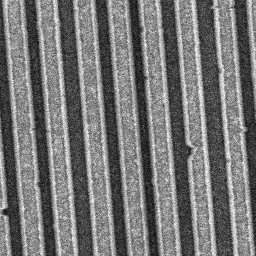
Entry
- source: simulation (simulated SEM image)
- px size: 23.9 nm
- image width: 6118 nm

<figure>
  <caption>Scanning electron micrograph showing parallel lines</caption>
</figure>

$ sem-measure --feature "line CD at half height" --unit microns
0.414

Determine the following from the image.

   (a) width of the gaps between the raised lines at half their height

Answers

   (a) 393 nanometres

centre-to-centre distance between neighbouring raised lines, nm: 835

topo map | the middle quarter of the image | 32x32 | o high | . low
....ooooo....oooo....oooo....ooo
....ooooo....oooo....oooo.....oo
.....oooo....oooo....oooo.....oo
.....oooo....oooo....oooo.....oo
.....oooo....oooo....oooo.....oo
.....oooo....oooo....oooo.....oo
.....oooo....oooo....oooo.....oo
.....oooo....ooooo...oooo.....oo
.....oooo....ooooo...oooo.....oo
.....oooo.....oooo...oooo.....oo
.....oooo.....oooo...ooooo.....o
.....oooo.....oooo...ooooo....oo
.....oooo.....oooo....oooo....oo
.....ooooo....oooo....oooo.....o
......oooo....oooo....oooo.....o
......oooo....oooo....oooo.....o
......oooo....oooo....oooo.....o
......oooo....oooo....oooo.....o
o.....oooo....oooo....oooo.....o
o.....oooo....ooooo...oooo.....o
o.....oooo....ooooo...oooo......
o.....oooo.....oooo...oooo......
o.....oooo.....oooo...oooo......
o.....oooo.....oooo...ooooo.....
o.....oooo.....oooo....oooo....o
o.....ooooo....oooo...ooooo.....
o.....ooooo....oooo....oooo.....
o......oooo....oooo....oooo.....
o......oooo....oooo....oooo.....
o......oooo....oooo....oooo.....
oo.....oooo....oooo....oooo.....
oo.....oooo....ooooo...oooo.....